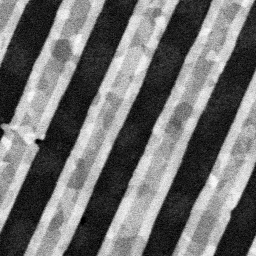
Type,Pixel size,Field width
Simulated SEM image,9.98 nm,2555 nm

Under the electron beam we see one or a few lines or trenches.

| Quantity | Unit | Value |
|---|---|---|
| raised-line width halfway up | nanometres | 277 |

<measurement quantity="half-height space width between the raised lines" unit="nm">397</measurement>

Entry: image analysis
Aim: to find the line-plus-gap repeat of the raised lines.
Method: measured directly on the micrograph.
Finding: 67.7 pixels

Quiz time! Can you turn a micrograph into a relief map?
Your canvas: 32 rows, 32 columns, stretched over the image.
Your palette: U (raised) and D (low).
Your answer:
UUUDDDDDUUUUDDDDDDUUUDDDDDDUUUUD
UUDDDDDDUUUUDDDDDUUUUDDDDDDUUUDD
UUDDDDDUUUUDDDDDDUUUUDDDDDUUUUDD
UDDDDDDUUUUDDDDDUUUUDDDDDDUUUUDD
UDDDDDDUUUUDDDDDUUUUDDDDDUUUUDDD
DDDDDDUUUUDDDDDDUUUDDDDDDUUUUDDD
DDDDDDUUUUDDDDDUUUUDDDDDUUUUDDDD
DDDDDUUUUDDDDDDUUUDDDDDDUUUUDDDD
DDDDDUUUUDDDDDUUUUDDDDDUUUUDDDDD
DDDDUUUUDDDDDDUUUUDDDDDUUUUDDDDD
DDDDUUUUDDDDDUUUUDDDDDDUUUDDDDDD
DDDUUUUDDDDDDUUUUDDDDDUUUUDDDDDU
DDDUUUUDDDDDUUUUDDDDDDUUUDDDDDDU
DDDUUUDDDDDDUUUUDDDDDUUUUDDDDDDU
DDUUUUDDDDDUUUUDDDDDDUUUUDDDDDUU
DDUUUUDDDDDUUUUDDDDDUUUUDDDDDDUU
DUUUUDDDDDDUUUDDDDDDUUUUDDDDDUUU
DUUUDDDDDDUUUUDDDDDUUUUDDDDDDUUU
UUUUDDDDDDUUUDDDDDDUUUUDDDDDUUUU
UUUUDDDDDUUUUDDDDDUUUUDDDDDDUUUU
UUUDDDDDDUUUDDDDDDUUUUDDDDDUUUUD
UUUDDDDDUUUUDDDDDUUUUDDDDDDUUUUD
UUDDDDDDUUUUDDDDDUUUUDDDDDUUUUDD
UUDDDDDUUUUDDDDDDUUUUDDDDDUUUUDD
UDDDDDDUUUUDDDDDUUUUDDDDDDUUUDDD
UDDDDDDUUUDDDDDDUUUUDDDDDUUUUDDD
UDDDDDUUUUDDDDDUUUUDDDDDDUUUDDDD
DDDDDDUUUDDDDDDUUUUDDDDDUUUUDDDD
DDDDDUUUUDDDDDUUUUDDDDDDUUUUDDDD
DDDDDUUUDDDDDDUUUUDDDDDUUUUDDDDD
DDDDUUUUDDDDDUUUUUDDDDDUUUUDDDDD
DDDDUUUDDDDDDUUUUDDDDDUUUUDDDDDD